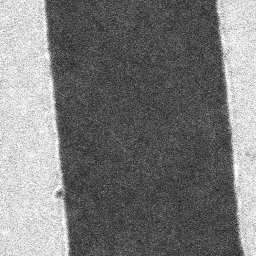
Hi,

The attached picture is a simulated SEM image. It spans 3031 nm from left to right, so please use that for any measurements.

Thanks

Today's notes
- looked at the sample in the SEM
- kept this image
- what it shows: one or a few lines or trenches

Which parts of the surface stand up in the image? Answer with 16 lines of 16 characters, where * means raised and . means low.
...***********..
...***********..
...***********..
...***********..
...***********..
...***********..
...***********..
...***********..
....***********.
....***********.
....***********.
....***********.
....***********.
....***********.
....***********.
....***********.